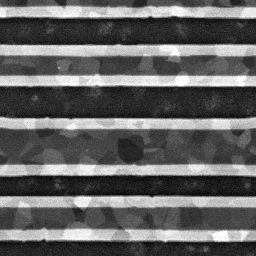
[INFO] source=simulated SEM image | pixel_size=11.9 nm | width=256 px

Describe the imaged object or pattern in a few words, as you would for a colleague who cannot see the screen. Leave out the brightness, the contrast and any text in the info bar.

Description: one or a few lines or trenches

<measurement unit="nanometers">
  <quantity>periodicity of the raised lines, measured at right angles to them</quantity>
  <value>910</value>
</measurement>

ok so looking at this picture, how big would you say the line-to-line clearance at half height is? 0.445 um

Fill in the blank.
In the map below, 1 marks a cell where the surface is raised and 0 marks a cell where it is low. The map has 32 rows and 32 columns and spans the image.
11111111111111111111111111111111
00000011111111111111111111111111
00000000000000000000000000000000
00000000000000000000000000000000
00000000000000000000000000000000
00000000000000000000000000000000
11111111111111111111111111111111
11111111111111111111111111111111
11111111111111111111111111111111
11111111111111111111111111111111
00000000000000000000000000000000
00000000000000000000000000000000
00000000000000000000000000000000
00000000000000000000000000000000
00000000000000000000000000000000
11111111111111111111111111111111
11111111111111111111111111111111
11111111111111111111111111111111
11111111111111111111111111111111
11111111111111111111111111111111
11111111111111111111111111111111
00000000000000000000000000000000
00000000000000000000000000000000
00000000000000000000000000000000
00000000000000000000000000000000
11111111111111111111111111111111
11111111111111111111111111111111
11111111111111111111111111111111
11111111111111111111111111111111
00000000000000000000000000000000
00000000000000000000000000000000
00000000000000000000000000000000